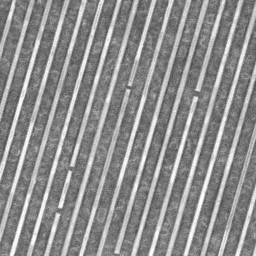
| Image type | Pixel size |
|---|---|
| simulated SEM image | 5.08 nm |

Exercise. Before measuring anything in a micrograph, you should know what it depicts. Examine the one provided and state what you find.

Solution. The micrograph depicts parallel lines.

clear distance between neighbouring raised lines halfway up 67.8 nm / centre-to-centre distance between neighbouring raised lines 84.9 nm